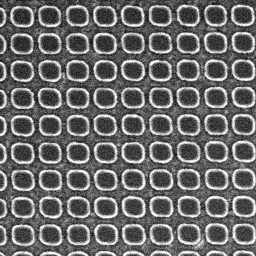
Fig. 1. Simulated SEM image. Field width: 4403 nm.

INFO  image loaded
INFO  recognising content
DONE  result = a regular array of raised bodies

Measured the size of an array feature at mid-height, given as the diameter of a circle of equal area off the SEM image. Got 0.373 microns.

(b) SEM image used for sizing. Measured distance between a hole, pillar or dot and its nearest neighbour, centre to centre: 27.2 pixels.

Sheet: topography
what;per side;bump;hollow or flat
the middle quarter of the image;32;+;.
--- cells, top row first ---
.+++++..+++++..+++++..+++++.++++
.+++++..+++++..+++++..+++++.++++
.+++++..+++++..+++++..+++++.++++
.+++++..+++++...+++...++++...+++
................................
................................
.++++...++++...++++...++++...+++
.+++++..+++++..+++++..+++++..+++
.+++++..+++++..+++++..+++++..+++
.+++++..+++++..+++++..+++++..+++
..+++....++++...+++....+++...+++
................................
................................
.++++...++++...++++...++++...+++
.+++++..+++++..+++++..+++++..+++
.+++++..+++++..+++++..+++++..+++
.+++++..+++++..+++++..+++++..+++
..+++....+++....+++....+++....++
................................
................................
.+++++..++++...++++...++++...+++
.+++++..+++++..+++++..+++++..+++
.+++++..+++++..+++++..+++++..+++
.+++++..+++++..+++++..+++++..+++
....+.....++.....++......+......
................................
................................
.+++++..+++++..+++++..+++++..+++
.+++++..+++++..+++++..+++++..+++
.+++++..+++++..+++++..+++++..+++
.+++++..+++++..+++++..+++++..+++
................................